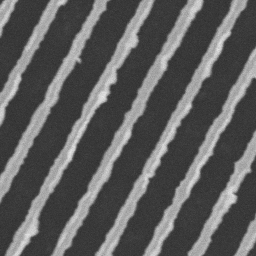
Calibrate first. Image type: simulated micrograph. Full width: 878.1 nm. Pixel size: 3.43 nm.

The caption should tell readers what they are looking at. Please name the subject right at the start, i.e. parallel lines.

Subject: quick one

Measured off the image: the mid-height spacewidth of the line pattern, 0.0979 µm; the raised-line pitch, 139 nm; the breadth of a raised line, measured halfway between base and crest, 41.2 nanometres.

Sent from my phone